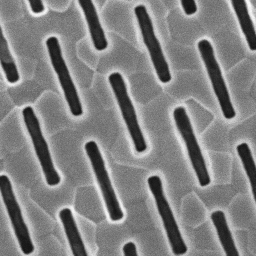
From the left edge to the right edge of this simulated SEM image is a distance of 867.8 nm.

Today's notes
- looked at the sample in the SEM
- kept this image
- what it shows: holes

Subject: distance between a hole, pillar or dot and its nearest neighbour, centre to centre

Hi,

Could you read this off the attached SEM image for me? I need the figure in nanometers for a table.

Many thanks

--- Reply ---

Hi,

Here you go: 244